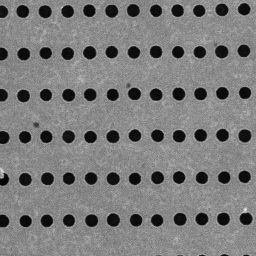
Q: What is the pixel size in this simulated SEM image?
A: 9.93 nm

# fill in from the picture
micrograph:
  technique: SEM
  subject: a regular array of holes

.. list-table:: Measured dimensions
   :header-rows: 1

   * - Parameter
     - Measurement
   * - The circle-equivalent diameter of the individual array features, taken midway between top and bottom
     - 125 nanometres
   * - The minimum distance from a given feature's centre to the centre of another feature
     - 0.217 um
